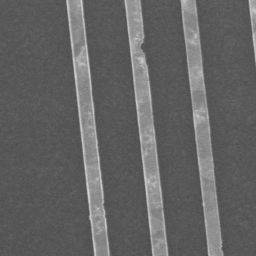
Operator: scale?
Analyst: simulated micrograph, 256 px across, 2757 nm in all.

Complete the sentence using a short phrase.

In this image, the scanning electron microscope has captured parallel lines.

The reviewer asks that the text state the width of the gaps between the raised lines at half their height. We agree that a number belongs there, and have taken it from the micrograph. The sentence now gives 0.463 um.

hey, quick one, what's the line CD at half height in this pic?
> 151 nanometres